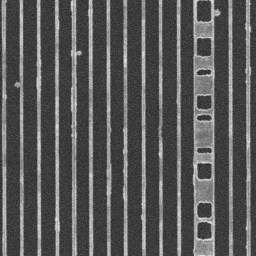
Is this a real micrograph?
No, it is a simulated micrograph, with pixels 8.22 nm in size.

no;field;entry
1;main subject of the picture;parallel lines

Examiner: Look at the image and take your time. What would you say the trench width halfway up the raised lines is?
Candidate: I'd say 14.5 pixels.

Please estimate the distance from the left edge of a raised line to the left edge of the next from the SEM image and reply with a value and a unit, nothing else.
143 nm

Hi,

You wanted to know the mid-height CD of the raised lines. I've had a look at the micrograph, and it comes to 22.6 nm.